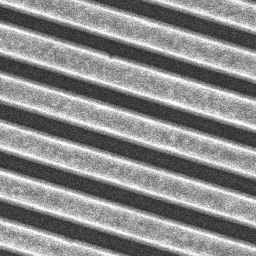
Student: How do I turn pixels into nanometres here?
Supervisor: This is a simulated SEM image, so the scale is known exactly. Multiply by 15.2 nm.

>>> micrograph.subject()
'parallel lines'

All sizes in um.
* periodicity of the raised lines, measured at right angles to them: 0.707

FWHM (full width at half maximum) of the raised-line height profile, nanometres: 411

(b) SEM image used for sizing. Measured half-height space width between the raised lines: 302 nm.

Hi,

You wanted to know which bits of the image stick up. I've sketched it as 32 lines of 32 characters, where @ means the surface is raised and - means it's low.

@@@@@@@@@@@@--------@@@@@@@@@@@@
---@@@@@@@@@@@@---------@@@@@@@@
-------@@@@@@@@@@@---------@@@@@
@@--------@@@@@@@@@@@@--------@@
@@@@@--------@@@@@@@@@@@@-------
@@@@@@@@@--------@@@@@@@@@@@----
@@@@@@@@@@@@--------@@@@@@@@@@@@
---@@@@@@@@@@@@--------@@@@@@@@@
------@@@@@@@@@@@@@-------@@@@@@
@---------@@@@@@@@@@@@--------@@
@@@@@--------@@@@@@@@@@@@-------
@@@@@@@@--------@@@@@@@@@@@@@---
@@@@@@@@@@@--------@@@@@@@@@@@@@
---@@@@@@@@@@@---------@@@@@@@@@
-------@@@@@@@@@@@--------@@@@@@
@---------@@@@@@@@@@@--------@@@
@@@@---------@@@@@@@@@@@--------
@@@@@@@---------@@@@@@@@@@@@----
@@@@@@@@@@@---------@@@@@@@@@@@-
---@@@@@@@@@@@---------@@@@@@@@@
------@@@@@@@@@@@---------@@@@@@
@--------@@@@@@@@@@@@---------@@
@@@@---------@@@@@@@@@@@--------
@@@@@@@---------@@@@@@@@@@@-----
@@@@@@@@@@@--------@@@@@@@@@@@@-
--@@@@@@@@@@@@---------@@@@@@@@@
------@@@@@@@@@@@---------@@@@@@
---------@@@@@@@@@@@@--------@@@
@@@@--------@@@@@@@@@@@@--------
@@@@@@@--------@@@@@@@@@@@@-----
@@@@@@@@@@---------@@@@@@@@@@@@-
---@@@@@@@@@@---------@@@@@@@@@@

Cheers